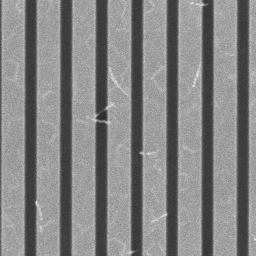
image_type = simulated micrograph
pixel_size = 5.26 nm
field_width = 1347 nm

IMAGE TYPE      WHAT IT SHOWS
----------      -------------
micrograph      parallel lines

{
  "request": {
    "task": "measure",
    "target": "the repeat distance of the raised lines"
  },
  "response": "186 nm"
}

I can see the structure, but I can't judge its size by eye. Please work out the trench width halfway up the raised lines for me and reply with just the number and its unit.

10.2 px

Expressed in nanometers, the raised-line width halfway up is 131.